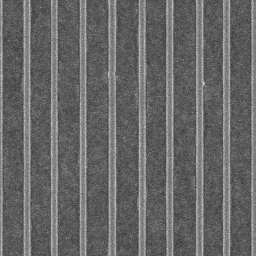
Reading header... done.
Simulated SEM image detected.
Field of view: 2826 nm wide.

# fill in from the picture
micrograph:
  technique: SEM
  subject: parallel lines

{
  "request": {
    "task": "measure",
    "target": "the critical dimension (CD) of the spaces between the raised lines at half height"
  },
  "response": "21.5 pixels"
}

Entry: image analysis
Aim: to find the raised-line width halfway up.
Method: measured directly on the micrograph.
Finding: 73.1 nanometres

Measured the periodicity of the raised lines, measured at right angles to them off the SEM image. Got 0.315 µm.